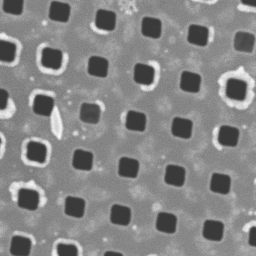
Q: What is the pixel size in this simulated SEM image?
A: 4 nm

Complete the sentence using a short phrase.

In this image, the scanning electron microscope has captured a regular array of holes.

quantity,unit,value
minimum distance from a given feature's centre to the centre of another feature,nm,186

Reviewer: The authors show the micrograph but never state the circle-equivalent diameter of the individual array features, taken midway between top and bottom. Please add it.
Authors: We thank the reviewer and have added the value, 88.4 nanometres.